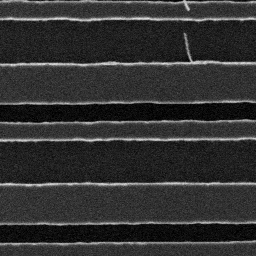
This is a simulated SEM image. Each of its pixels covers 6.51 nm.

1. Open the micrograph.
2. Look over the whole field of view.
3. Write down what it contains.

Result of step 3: lines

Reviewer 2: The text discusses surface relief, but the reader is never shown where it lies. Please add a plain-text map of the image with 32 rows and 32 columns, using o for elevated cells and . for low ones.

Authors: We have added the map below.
oooooooooooooooooooooooooooooooo
oooooooooooooooooooooooooooooooo
................................
................................
................................
................................
................................
................................
oooooooooooooooooooooooooooooooo
oooooooooooooooooooooooooooooooo
oooooooooooooooooooooooooooooooo
oooooooooooooooooooooooooooooooo
oooooooooooooooooooooooooooooooo
................................
................................
oooooooooooooooooooooooooooooooo
oooooooooooooooooooooooooooooooo
................................
................................
................................
................................
................................
................................
oooooooooooooooooooooooooooooooo
oooooooooooooooooooooooooooooooo
oooooooooooooooooooooooooooooooo
oooooooooooooooooooooooooooooooo
oooooooooooooooooooooooooooooooo
................................
................................
oooooooooooooooooooooooooooooooo
oooooooooooooooooooooooooooooooo